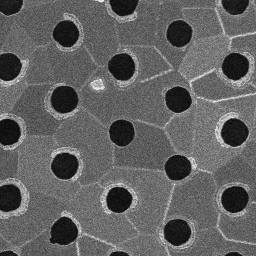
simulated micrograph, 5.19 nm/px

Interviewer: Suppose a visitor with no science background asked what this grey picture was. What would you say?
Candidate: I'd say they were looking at a regular array of holes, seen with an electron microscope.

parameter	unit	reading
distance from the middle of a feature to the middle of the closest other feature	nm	337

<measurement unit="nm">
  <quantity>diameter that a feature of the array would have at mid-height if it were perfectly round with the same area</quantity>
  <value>142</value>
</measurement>